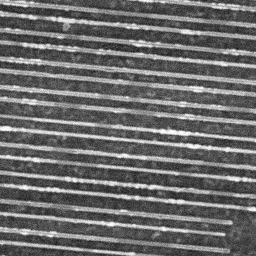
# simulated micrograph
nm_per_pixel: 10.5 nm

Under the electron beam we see parallel lines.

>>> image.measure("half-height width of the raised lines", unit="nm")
35.4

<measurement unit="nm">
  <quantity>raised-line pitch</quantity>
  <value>149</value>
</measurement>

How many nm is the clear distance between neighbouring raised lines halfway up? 99.7